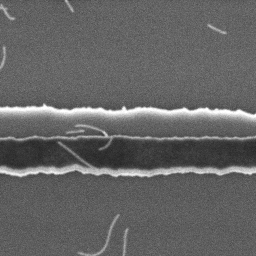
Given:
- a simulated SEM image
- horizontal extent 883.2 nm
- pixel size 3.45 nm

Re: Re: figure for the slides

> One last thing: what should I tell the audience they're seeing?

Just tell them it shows lines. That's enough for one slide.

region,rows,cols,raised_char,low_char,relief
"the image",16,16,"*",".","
................
................
................
................
................
................
................
****************
****************
****************
****************
................
................
................
................
................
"